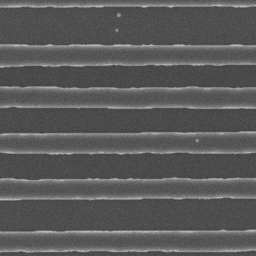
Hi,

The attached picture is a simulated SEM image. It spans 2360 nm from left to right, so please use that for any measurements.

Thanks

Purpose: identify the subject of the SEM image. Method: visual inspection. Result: lines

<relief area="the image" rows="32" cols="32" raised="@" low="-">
@@@@@@@@@@@@@@@@@@@@@@@@@@@@@@@@
--------------------------------
--------------------------------
--------------------------------
--------------------------------
--------------------------------
@@@@@@@@@@@@@@@@@@@@@@@@@@@@@@@@
@@@@@@@@@@@@@@@@@@@@@@@@@@@@@@@@
--------------------------------
--------------------------------
--------------------------------
@@@@@@@@@@@@@@@@@@@@@@@@@@@@@@@@
@@@@@@@@@@@@@@@@@@@@@@@@@@@@@@@@
-------------@@@@@@----@@@@@@@@@
--------------------------------
--------------------------------
-----------------------------@@@
@@@@@@@@@@@@@@@@@@@@@@@@@@@@@@@@
@@@@@@@@@@@@@@@@@@@@@@@@@@@@@@@@
--------------------------------
--------------------------------
--------------------------------
@@@@-@@@@@@@@@@@@@@@@@@@@@@@@@@@
@@@@@@@@@@@@@@@@@@@@@@@@@@@@@@@@
@@@@@@@@@@@@@@@@@@@@@@@@@@@@@@@@
--------------------------------
--------------------------------
--------------------------------
--------------------------------
@@@@@@@@@@@@@@@@@@@@@@@@@@@@@@@@
@@@@@@@@@@@@@@@@@@@@@@@@@@@@@@@@
@--@----------------------------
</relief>